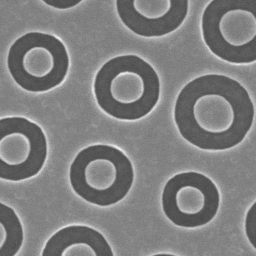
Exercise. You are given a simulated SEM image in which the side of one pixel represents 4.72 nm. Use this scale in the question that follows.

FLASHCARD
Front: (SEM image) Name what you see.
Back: ring-shaped grooves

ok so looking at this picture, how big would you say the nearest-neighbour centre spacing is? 428 nm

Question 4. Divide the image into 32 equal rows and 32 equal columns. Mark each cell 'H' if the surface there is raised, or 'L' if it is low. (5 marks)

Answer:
HHHHHHLLLLHHHHHLLHHHHLLLHHLLLLLL
HHHHHHHHHHHHHHHLLHHHHLLHHLLLLHHL
HHHHHHHHHHHHHHHLLLLLLLLHHLLLHHHH
HHHHHHHHHHHHHHHHLLLLLLHHHLLHHHHH
HHHLLLLHHHHHHHHHHHLLHHHHHLLLHHHH
HHLLLLLLHHHHHHHHHHHHHHHHHHLLLHLL
HLLLHHLLHHHHHHHHHHHHHHHHHHHLLLLL
HLLHHHHLLHHHHHLLLLHHHHHHHHHHLLLL
HLLHHHLLHHHHHLLLLLLHHHHHHHHHHHHH
HHLLLLLLHHHHLLLHHLLLHHHHHLLLHHHH
HHLLLLLHHHHHLLHHHHLLHHHLLLLLLLHH
HHHHHHHHHHHHLLHHHHLLHHHLLLLLLLLH
HHHHHHHHHHHHLLLHHLLLHHLLLHHHLLLH
HHHHHHHHHHHHHLLLLLLHHHLLHHHHHLLL
HHHHHHHHHHHHHHLLLLHHHHLLHHHHHLLL
LLLLHHHHHHHHHHHHHHHHHHLLLHHHHLLL
LLLLLHHHHHHHHHHHHHHHHHLLLLLLLLLH
HHHLLLHHHHHHHHHHHHHHHHHLLLLLLLHH
HHHHLLHHHHHLLLHHHHHHHHHHHLLLLHHH
HHHLLLHHHHLLLLLLHHHHHHHHHHHHHHHH
LHLLLHHHHLLHHHLLHHHHHHHHHHHHHHHH
LLLLLHHHHLLHHHLLLHHHHHHHHHHHHHHH
HLLHHHHHHLLHHHLLLHHHHLLLLLHHHHHH
HHHHHHHHHLLLHLLLHHHHHLLHLLLHHHHH
HHHHHHHHHHLLLLLLHHHHLLHHHLLHHHHH
HHHHHHHHHHHHLLHHHHHHLLHHHLLHHHHH
LLHHHHHHHHHHHHHHHHHHHLLHHLLHHHHL
LLHHHHHHHHHHHHHHHHHHHLLLLLHHHHHL
LLLHHHHHLLLHHHHHHHHHHHHHHHHHHHHL
HLLHHHLLLLLLLHHHHHHHHHHHHHHHHHHL
LLLHHHLLLLHLLLHHHHHHHHHHHHHHHHHL
LLHHHLLLHHHHLLHHHHHHHHHHHHHHHHHH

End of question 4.